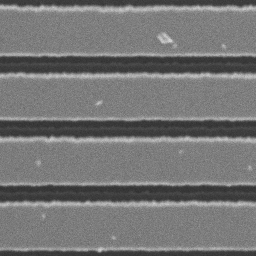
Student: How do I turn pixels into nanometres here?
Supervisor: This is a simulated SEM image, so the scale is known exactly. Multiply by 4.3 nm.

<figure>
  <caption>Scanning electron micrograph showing lines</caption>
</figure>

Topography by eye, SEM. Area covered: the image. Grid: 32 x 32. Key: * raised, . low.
................................
********************************
********************************
********************************
********************************
********************************
********************************
................................
................................
********************************
********************************
********************************
********************************
********************************
********************************
................................
................................
********************************
********************************
********************************
********************************
********************************
********************************
................................
................................
********************************
********************************
********************************
********************************
********************************
********************************
................................